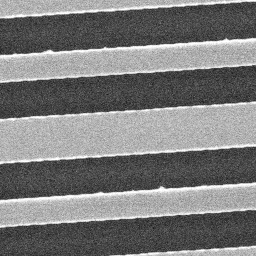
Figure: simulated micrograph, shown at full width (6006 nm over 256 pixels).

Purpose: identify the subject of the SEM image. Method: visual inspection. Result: lines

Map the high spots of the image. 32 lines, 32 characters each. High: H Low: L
HHHHHHHHHHHHHHHHHHHHHHHHHLLLLLLL
HHHHHHHHHHHLLLLLLLLLLLLLLLLLLLLL
LLLLLLLLLLLLLLLLLLLLLLLLLLLLLLLL
LLLLLLLLLLLLLLLLLLLLLLLLLLLLLLLL
LLLLLLLLLLLLLLLLLLLLLLLLLLLLLLLL
LLLLLLLLLLLLLLLLLLLLLLHHHHHHHHHH
LLLLLLLHHHHHHHHHHHHHHHHHHHHHHHHH
HHHHHHHHHHHHHHHHHHHHHHHHHHHHHHHH
HHHHHHHHHHHHHHHHHHHHHHHHHHHLLLLL
HHHHHHHHHHLLLLLLLLLLLLLLLLLLLLLL
LLLLLLLLLLLLLLLLLLLLLLLLLLLLLLLL
LLLLLLLLLLLLLLLLLLLLLLLLLLLLLLLL
LLLLLLLLLLLLLLLLLLLLLLLLLLLLLLLL
LLLLLLLLLLLLLLLLLLLLLLHHHHHHHHHH
LLLLLLHHHHHHHHHHHHHHHHHHHHHHHHHH
HHHHHHHHHHHHHHHHHHHHHHHHHHHHHHHH
HHHHHHHHHHHHHHHHHHHHHHHHHHHHHHHH
HHHHHHHHHHHHHHHHHHHHHHHHHHHHHHHH
HHHHHHHHHHHHHHHHHHHHHHHHHHHHHLLL
HHHHHHHHHHHHHLLLLLLLLLLLLLLLLLLL
LLLLLLLLLLLLLLLLLLLLLLLLLLLLLLLL
LLLLLLLLLLLLLLLLLLLLLLLLLLLLLLLL
LLLLLLLLLLLLLLLLLLLLLLLLLLLLLLLL
LLLLLLLLLLLLLLLLLLLLLLLHHHHHHHHH
LLLLLLLLLHHHHHHHHHHHHHHHHHHHHHHH
HHHHHHHHHHHHHHHHHHHHHHHHHHHHHHHH
HHHHHHHHHHHHHHHHHHHHHHHHHHHHLLLL
HHHHHHHHHHHHHLLLLLLLLLLLLLLLLLLL
LLLLLLLLLLLLLLLLLLLLLLLLLLLLLLLL
LLLLLLLLLLLLLLLLLLLLLLLLLLLLLLLL
LLLLLLLLLLLLLLLLLLLLLLLLLLLLLLLL
LLLLLLLLLLLLLLLLLLLLLLHHHHHHHHHH